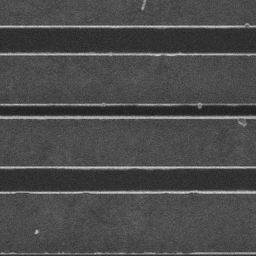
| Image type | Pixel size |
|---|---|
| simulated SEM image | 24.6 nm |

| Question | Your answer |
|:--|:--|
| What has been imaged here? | lines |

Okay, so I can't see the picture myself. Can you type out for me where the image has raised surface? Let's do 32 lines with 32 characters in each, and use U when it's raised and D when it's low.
DDDDDDDDDDDDDDDDDDDDDDDDDDDDDDDD
DDDDDDDDDDDDDDDDDDDDDDDDDDDDDDDD
DDDDDDDDDDDDDDDDDDDDDDDDDDDDDDDD
UUUUUUUUUUUUUUUUUUUUUUUUUUUUUUUU
UUUUUUUUUUUUUUUUUUUUUUUUUUUUUUUU
UUUUUUUUUUUUUUUUUUUUUUUUUUUUUUUU
UUUUUUUUUUUUUUUUUUUUUUUUUUUUUUUU
DDDDDDDDDDDDDDDDDDDDDDDDDDDDDDDD
DDDDDDDDDDDDDDDDDDDDDDDDDDDDDDDD
DDDDDDDDDDDDDDDDDDDDDDDDDDDDDDDD
DDDDDDDDDDDDDDDDDDDDDDDDDDDDDDDD
DDDDDDDDDDDDDDDDDDDDDDDDDDDDDDDD
DDDDDDDDDDDDDDDDDDDDDDDDDDDDDDDD
UUUUUUUUUUUUUUUUUUUUUUUUUUUUUUUU
UUUUUUUUUUUUUUUUUUUUUUUUUUUUUUUU
DDDDDDDDDDDDDDDDDDDDDDDDDDDDDDDD
DDDDDDDDDDDDDDDDDDDDDDDDDDDDDDDD
DDDDDDDDDDDDDDDDDDDDDDDDDDDDDDDD
DDDDDDDDDDDDDDDDDDDDDDDDDDDDDDDD
DDDDDDDDDDDDDDDDDDDDDDDDDDDDDDDD
DDDDDDDDDDDDDDDDDDDDDDDDDDDDDDDD
UUUUUUUUUUUUUUUUUUUUUUUUUUUUUUUU
UUUUUUUUUUUUUUUUUUUUUUUUUUUUUUUU
UUUUUUUUUUUUUUUUUUUUUUUUUUUUUUUU
DDDDDDDDDDDDDDDDDDDDDDDDDDDDDDDD
DDDDDDDDDDDDDDDDDDDDDDDDDDDDDDDD
DDDDDDDDDDDDDDDDDDDDDDDDDDDDDDDD
DDDDDDDDDDDDDDDDDDDDDDDDDDDDDDDD
DDDDDDDDDDDDDDDDDDDDDDDDDDDDDDDD
DDDDDDDDDDDDDDDDDDDDDDDDDDDDDDDD
DDDDDDDDDDDDDDDDDDDDDDDDDDDDDDDD
DDDDDDDDDDDDDDDDDDDDDDDDDDDDDDDD